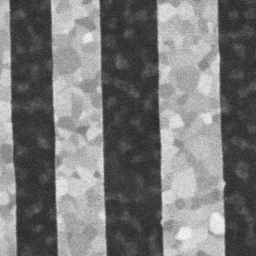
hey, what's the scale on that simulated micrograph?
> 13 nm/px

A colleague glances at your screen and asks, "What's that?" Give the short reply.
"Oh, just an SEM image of one or a few lines or trenches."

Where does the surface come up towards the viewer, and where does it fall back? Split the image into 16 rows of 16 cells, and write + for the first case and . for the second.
+..+++....++++..
+..+++....++++..
+..+++....++++..
+..+++....++++..
+..+++....++++..
+..+++....++++..
+..+++....++++..
+..+++....++++..
+..+++....++++..
+..+++....++++..
+..+++....++++..
+...++....++++..
+...+++...++++..
+...+++...++++..
+...+++...++++..
+...+++...++++..